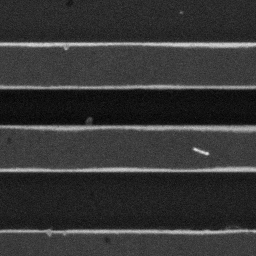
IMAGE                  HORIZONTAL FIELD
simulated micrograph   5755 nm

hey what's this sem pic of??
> lines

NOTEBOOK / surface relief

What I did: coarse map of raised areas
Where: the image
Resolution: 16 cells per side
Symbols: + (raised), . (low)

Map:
................
................
................
++++++++++++++++
++++++++++++++++
................
................
................
++++++++++++++++
++++++++++++++++
++++++++++++++++
................
................
................
++++++++++++++++
++++++++++++++++